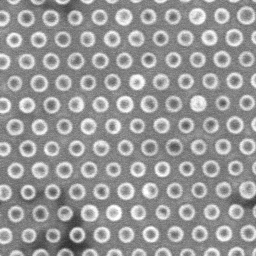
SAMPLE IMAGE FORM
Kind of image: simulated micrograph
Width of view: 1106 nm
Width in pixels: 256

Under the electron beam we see a regular array of raised bodies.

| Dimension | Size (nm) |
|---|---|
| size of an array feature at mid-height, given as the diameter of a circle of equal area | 61.9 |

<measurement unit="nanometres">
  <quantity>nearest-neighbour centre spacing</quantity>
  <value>105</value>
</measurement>